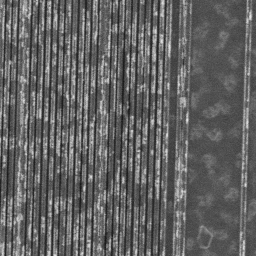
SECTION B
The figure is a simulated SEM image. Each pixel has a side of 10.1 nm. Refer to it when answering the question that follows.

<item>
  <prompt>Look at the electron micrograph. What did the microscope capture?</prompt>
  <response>parallel lines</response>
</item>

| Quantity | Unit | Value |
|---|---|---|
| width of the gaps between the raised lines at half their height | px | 1.88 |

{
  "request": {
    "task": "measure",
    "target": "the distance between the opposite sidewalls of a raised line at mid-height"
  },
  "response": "48.1 nanometers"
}